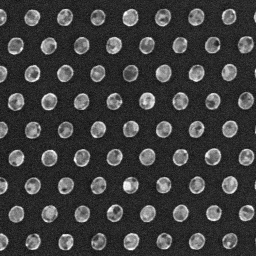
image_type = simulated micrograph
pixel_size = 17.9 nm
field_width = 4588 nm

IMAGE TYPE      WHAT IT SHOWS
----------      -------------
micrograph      a regular array of raised bodies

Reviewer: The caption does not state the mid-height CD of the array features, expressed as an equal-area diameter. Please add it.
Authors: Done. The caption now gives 276 nanometers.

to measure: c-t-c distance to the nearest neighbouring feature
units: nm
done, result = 576